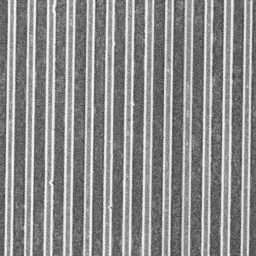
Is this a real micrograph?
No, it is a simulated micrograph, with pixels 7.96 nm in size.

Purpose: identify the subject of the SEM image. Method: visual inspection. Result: parallel lines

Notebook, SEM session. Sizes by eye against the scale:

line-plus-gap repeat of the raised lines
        157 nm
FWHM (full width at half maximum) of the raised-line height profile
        51.8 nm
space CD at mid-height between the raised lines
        102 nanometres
